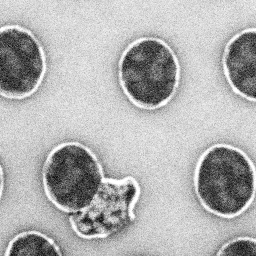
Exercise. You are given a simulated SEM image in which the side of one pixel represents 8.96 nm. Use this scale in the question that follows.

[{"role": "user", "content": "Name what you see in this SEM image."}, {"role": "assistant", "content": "raised bodies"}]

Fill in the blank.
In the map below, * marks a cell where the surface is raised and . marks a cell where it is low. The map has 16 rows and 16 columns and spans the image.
................
................
**.......*.....*
***.....***...**
***.....***...**
**......***....*
.........*......
................
................
...***.......**.
...***......****
...*****....****
...*****.....***
.....***........
.....**.........
.***..........**